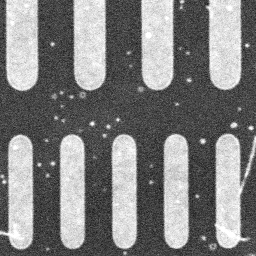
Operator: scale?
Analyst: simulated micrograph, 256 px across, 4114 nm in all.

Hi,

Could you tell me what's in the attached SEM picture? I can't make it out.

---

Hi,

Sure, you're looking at groups of lines, slits or small figures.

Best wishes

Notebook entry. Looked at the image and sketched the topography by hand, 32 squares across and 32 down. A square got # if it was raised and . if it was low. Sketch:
.####....####.....###.....####..
.####....####.....###.....####..
.####....####.....###.....####..
.####....####.....###.....####..
.####....####.....###.....####..
.####....####.....###.....####..
.####....####.....###.....####..
.####....####.....###.....####..
.####....####.....###.....####..
.####....####.....###.....####..
.###......###.....###......##...
................................
................................
................................
................................
................................
................................
..##....##....###....##....###..
.###....##....###....##....###..
.###....##....###....##....###..
.###....##....###....##....###..
.###....##....###....##....###..
.###....##....###....##....###..
.###....##....###....##....###..
.###....##....###....##....###..
.###....##....###....##....###..
.###....##....###....##....###..
.###....##....###....##....###..
.###....##....###....##....###..
.###....##....###....##....###..
..##....##.....##....##.....#...
................................